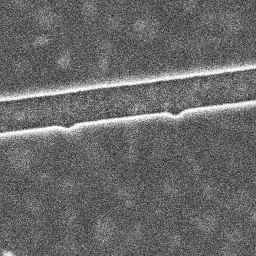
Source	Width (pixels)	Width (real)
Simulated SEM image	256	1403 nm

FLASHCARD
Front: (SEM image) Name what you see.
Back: one or a few lines or trenches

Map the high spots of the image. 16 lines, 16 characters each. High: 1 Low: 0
1111111111111111
1111111111111111
1111111111111111
1111111111111111
1111111111111100
1111110000000000
0000000000000001
0000000111111111
1111111111111111
1111111111111111
1111111111111111
1111111111111111
1111111111111111
1111111111111111
1111111111111111
1111111111111111